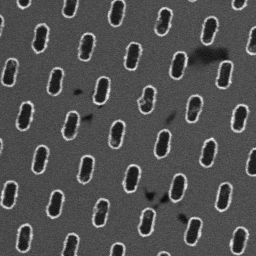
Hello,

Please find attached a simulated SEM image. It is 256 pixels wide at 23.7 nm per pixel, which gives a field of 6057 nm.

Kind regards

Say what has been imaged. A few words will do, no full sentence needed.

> a regular array of raised bodies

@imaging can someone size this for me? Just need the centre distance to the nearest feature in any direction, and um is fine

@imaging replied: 1.09